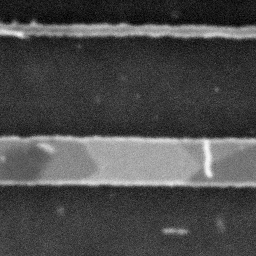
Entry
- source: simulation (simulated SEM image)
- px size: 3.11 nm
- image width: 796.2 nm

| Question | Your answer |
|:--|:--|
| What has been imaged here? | lines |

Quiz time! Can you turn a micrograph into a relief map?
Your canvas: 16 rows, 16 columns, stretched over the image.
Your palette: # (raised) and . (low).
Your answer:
................
................
................
................
................
................
................
................
................
################
################
.###.#.#########
................
................
................
................